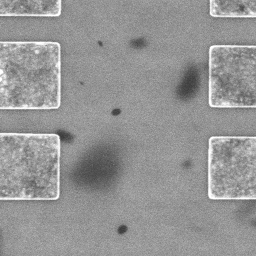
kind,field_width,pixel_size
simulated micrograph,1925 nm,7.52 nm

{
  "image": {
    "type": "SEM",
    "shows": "wiring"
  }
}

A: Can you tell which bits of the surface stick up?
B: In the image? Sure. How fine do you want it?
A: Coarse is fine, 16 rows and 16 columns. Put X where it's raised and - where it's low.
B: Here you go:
XXXX---------XXX
----------------
----------------
XXXX---------XXX
XXXX---------XXX
XXXX---------XXX
XXXX---------XXX
----------------
-XX-------------
XXXX---------XXX
XXXX---------XXX
XXXX---------XXX
----------------
----------------
----------------
----------------